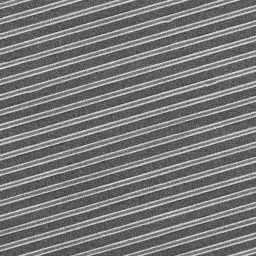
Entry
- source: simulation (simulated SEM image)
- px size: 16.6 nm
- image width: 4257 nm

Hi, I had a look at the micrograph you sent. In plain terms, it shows parallel lines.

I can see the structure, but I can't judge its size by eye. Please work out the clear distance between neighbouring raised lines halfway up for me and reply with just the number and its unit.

170 nanometers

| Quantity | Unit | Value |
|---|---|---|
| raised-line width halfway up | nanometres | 77.9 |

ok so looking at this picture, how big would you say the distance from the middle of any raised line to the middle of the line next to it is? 242 nanometers